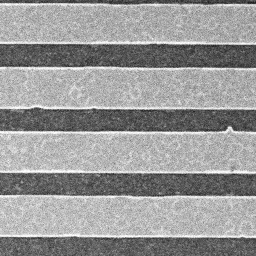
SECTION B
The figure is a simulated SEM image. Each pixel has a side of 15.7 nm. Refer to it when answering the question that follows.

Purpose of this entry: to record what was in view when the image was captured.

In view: one or a few lines or trenches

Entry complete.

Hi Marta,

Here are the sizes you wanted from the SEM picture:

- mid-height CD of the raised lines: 624 nanometers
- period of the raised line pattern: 1.01 µm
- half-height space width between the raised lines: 381 nm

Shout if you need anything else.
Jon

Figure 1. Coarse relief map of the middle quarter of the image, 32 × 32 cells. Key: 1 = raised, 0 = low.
00000000000000000000000000000000
11111111111111111111111111111111
11111111111111111111111111111111
11111111111111111111111111111111
11111111111111111111111111111111
11111111111111111111111111111111
11111111111111111111111111111111
11111111111111111111111111111111
11111111111111111111111111111111
11111111111111111111111111111111
11111111111111111111111111111111
00000000000000000000000000000000
00000000000000000000000000000000
00000000000000000000000000000000
00000000000000000000000000000000
00000000000000000000000000000000
00000000000000000000000000000000
11111111111111111111111111111111
11111111111111111111111111111111
11111111111111111111111111111111
11111111111111111111111111111111
11111111111111111111111111111111
11111111111111111111111111111111
11111111111111111111111111111111
11111111111111111111111111111111
11111111111111111111111111111111
11111111111111111111111111111111
00000000000000000000000000000000
00000000000000000000000000000000
00000000000000000000000000000000
11000000000000000000000000000000
10000000000000000000000000000000